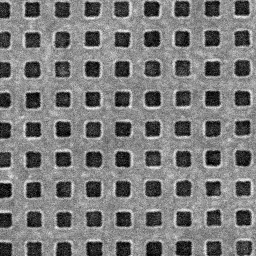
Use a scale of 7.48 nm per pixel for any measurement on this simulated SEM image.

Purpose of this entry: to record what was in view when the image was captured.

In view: a regular array of holes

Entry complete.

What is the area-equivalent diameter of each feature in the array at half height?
137 nm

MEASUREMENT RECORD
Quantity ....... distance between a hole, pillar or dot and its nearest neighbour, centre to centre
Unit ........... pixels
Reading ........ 29.4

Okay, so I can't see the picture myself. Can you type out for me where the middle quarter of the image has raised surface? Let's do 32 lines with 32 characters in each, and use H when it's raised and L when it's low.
LLHHHLLLLHHHLLLLLHHHLLLLHHHLLLLL
LLHHHLLLLHHHLLLLLHHHLLLLHHHLLLLL
LLHHHLLLLHHHLLLLHHHHLLLLHHHHLLLL
LHHHHHLLHHHHHHHHHHHHHHHHHHHHHHHH
HHHHHHHHHHHHHHHHHHHHHHHHHHHHHHHH
HHHHHHHHHHHHHHHHHHHHHHHHHHHHHHHH
HHHHHHHHHHHHHHHHHHHHHHHHHHHHHHHH
LLHHHLLLLHHHLLLLLHHHLLLLHHHHLLLL
LLHHHLLLLLHHLLLLLHHHLLLLHHHHLLLL
LLHHHLLLLLHHHLLLLHHHLLLLHHHHLLLL
LLHHHLLLLHHHHLLLHHHHLLLLHHHHLLLH
HHHHHHHHHHHHHHHHHHHHHHHHHHHHHHHH
HHHHHHHHHHHHHHHHHHHHHHHHHHHHHHHH
HHHHHHHHHHHHHHHHHHHHHHHHHHHHHHHH
LHHHHHLLLHHHHLLLLHHHLLLLHHHHLLLL
LLHHHLLLLLHHHLLLLHHHLLLLHHHLLLLL
LLHHHLLLLLHHHLLLLHHHLLLLHHHLLLLL
LLHHHLLLLHHHHLLLLHHHLLLLHHHLLLLL
HHHHHHLLHHHHHHHHHHHHHLLHHHHHHHHH
HHHHHHHHHHHHHHHHHHHHHHHHHHHHHHHH
HHHHHHHHHHHHHHHHHHHHHHHHHHHHHHHH
HHHHHHHHHHHHHHHHHHHHHHHHHHHHLHLH
LLHHHLLLLHHHHLLLLHHHLLLLHHHHLLLL
LLHHHLLLLLHHHLLLLHHHLLLLLHHLLLLL
LLHHHLLLLLHHHLLLLHHHLLLLLHHHLLLL
LLHHHLLLLHHHHLLLLHHHHLLLHHHHLLLL
HHHHHHHHHHHHHHHHHHHHHHHHHHHHHHHH
HHHHHHHHHHHHHHHHHHHHHHHHHHHHHHHH
HHHHHHHHHHHHHHHHHHHHHHHHHHHHHHHH
LLHHHHLLLHHHHLLLHHHHLLLLHHHHLLLL
LLHHHLLLLLHHHLLLLHHHLLLLLHHHLLLL
LLHHHLLLLLHHHLLLLHHHLLLLLHHHLLLL